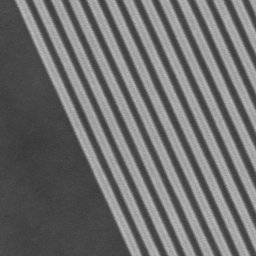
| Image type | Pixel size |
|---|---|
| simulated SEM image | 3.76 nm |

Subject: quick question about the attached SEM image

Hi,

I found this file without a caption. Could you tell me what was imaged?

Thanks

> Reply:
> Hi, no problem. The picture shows parallel lines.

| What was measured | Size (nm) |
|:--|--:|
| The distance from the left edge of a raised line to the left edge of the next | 61.6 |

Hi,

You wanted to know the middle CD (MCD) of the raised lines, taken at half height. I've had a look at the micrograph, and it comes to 28.7 nm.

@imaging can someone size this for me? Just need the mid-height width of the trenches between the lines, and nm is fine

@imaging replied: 32.1